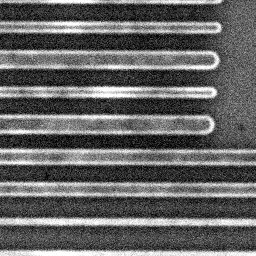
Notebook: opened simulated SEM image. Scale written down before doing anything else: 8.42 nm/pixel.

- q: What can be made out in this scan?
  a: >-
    groups of lines, slits or small figures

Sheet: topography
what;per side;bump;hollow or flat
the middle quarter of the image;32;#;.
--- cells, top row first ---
################################
................................
................................
................................
................................
................................
################################
################################
................................
................................
................................
................................
................................
################################
################################
################################
################################
................................
................................
................................
................................
................................
################################
################################
################################
................................
................................
................................
................................
................................
################################
################################